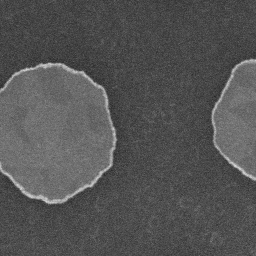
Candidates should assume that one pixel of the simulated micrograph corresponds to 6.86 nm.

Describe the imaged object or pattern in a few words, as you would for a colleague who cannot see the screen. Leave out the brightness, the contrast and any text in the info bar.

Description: raised bodies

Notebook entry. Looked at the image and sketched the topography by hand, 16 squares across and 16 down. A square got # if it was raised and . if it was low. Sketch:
................
................
................
................
.####..........#
######........##
#######.......##
#######......###
#######......###
#######.......##
#######........#
.#####..........
...#............
................
................
................